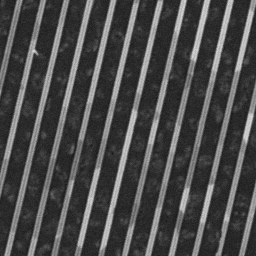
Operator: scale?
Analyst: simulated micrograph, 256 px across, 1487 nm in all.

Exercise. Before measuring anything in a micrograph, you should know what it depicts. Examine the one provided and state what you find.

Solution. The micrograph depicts parallel lines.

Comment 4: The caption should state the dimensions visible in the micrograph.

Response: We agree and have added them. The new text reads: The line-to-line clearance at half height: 110 nm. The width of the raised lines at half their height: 22 nanometers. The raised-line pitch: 0.133 micrometres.